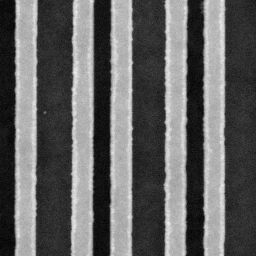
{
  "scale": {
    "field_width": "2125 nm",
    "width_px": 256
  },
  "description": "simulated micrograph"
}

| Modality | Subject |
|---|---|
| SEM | lines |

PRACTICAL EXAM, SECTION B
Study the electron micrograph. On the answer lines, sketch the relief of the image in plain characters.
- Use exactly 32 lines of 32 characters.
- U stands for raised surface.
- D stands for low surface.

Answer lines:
DDUUUDDDDUUUDDUUDDDDDUUDDDUUDDDD
DDUUUDDDDUUUDDUUDDDDDUUDDDUUDDDD
DDUUDDDDDUUUDDUUDDDDDUUDDDUUDDDD
DDUUDDDDDUUUDDUUDDDDDUUDDDUUDDDD
DDUUUDDDDUUUDDUUDDDDDUUDDDUUDDDD
DDUUDDDDDUUUDDUUDDDDDUUDDDUUDDDD
DDUUDDDDDUUUDDUUDDDDDUUDDDUUDDDD
DDUUDDDDDUUUDDUUDDDDDUUDDDUUDDDD
DDUUDDDDDUUUDDUUDDDDDUUDDDUUDDDD
DDUUDDDDDUUUDDUUDDDDDUUDDDUUDDDD
DDUUDDDDDUUUDDUUDDDDDUUDDDUUDDDD
DDUUDDDDDUUUDDUUDDDDDUUDDDUUDDDD
DDUUDDDDDUUUDDUUDDDDDUUDDDUUDDDD
DDUUDDDDDUUUDDUUDDDDDUUDDDUUDDDD
DDUUDDDDDUUUDDUUDDDDDUUDDDUUDDDD
DDUUDDDDDUUUDDUUDDDDDUUDDDUUDDDD
DDUUDDDDDUUUDDUUDDDDDUUDDDUUDDDD
DDUUDDDDDUUUDDUUDDDDDUUDDDUUDDDD
DDUUDDDDDUUUDDUUDDDDDUUDDDUUDDDD
DDUUDDDDDUUUDDUUDDDDDUUDDDUUDDDD
DDUUDDDDDUUUDDUUDDDDDUUDDDUUDDDD
DDUUDDDDDUUUDDUUDDDDDUUDDDUUDDDD
DDUUDDDDDUUUDDUUDDDDDUUDDDUUDDDD
DDUUDDDDDUUUDDUUDDDDDUUDDDUUDDDD
DDUUDDDDDUUUDDUUDDDDDUUDDDUUDDDD
DDUUDDDDDUUUDDUUDDDDDUUDDDUUDDDD
DDUUDDDDDUUUDDUUDDDDDUUDDDUUDDDD
DDUUDDDDDUUUDDUUDDDDDUUDDDUUDDDD
DDUUDDDDDUUUDDUUDDDDDUUDDDUUDDDD
DDUUDDDDDUUUDDUUDDDDDUUDDDUUDDDD
DDUUDDDDDUUUDDUUDDDDDUUDDDUUDDDD
DDUUDDDDDUUUDDUUDDDDDUUDDDUUDDDD